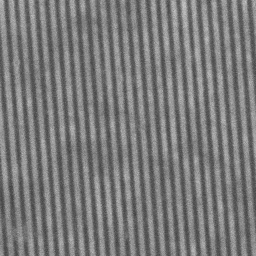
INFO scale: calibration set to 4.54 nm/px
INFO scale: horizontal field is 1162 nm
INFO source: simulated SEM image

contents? parallel lines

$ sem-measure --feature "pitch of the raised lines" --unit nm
45.8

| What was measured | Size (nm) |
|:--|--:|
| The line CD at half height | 17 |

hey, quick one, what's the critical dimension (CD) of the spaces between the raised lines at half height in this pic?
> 6.48 px